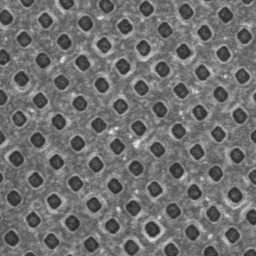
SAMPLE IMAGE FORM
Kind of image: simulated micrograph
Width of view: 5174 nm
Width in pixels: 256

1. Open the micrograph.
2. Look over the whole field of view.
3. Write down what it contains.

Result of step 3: a regular array of holes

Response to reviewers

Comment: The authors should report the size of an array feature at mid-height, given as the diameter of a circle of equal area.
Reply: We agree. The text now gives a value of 316 nm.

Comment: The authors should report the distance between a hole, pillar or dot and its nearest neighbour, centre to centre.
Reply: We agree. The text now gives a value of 27.8 px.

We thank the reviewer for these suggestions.